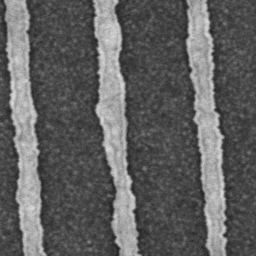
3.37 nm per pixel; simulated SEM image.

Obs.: one or a few lines or trenches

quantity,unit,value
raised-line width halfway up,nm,59.1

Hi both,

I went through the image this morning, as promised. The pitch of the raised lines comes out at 307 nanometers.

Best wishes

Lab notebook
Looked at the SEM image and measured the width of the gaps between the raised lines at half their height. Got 0.245 micrometres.